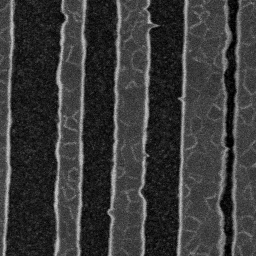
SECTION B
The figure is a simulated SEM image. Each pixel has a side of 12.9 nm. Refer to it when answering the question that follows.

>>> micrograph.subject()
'one or a few lines or trenches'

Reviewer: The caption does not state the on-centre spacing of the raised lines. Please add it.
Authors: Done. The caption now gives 859 nm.